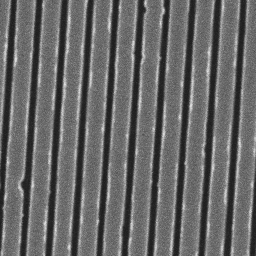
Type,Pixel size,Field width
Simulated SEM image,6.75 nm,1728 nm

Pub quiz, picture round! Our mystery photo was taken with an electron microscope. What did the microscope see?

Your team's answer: parallel lines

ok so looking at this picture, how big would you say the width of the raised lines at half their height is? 124 nanometres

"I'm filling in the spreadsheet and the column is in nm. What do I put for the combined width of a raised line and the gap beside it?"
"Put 172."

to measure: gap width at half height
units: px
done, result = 6.98